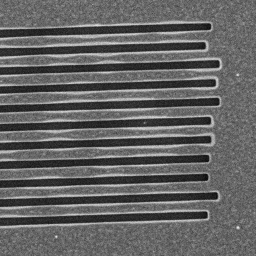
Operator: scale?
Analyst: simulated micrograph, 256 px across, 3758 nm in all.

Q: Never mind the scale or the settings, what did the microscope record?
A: groups of lines, slits or small figures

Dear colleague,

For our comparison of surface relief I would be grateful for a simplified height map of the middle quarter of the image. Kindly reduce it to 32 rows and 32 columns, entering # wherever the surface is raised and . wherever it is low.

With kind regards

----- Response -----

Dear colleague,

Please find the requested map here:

................................
.........................#######
################################
################################
##############..................
................................
....................############
################################
################################
................................
................................
....................############
################################
################................
................................
................................
...#############################
################################
##########......................
................................
............................####
################################
################################
####............................
................................
...............#################
################################
#############################...
................................
..............................##
...#############################
################################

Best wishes